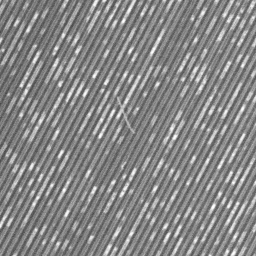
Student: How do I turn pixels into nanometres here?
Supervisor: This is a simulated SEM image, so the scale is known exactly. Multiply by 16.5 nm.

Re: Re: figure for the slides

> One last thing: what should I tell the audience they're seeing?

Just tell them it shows parallel lines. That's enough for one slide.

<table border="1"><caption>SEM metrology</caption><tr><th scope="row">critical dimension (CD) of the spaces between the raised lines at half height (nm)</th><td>67.4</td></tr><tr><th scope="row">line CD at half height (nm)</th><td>43.7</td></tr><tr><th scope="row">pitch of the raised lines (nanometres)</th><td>110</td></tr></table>